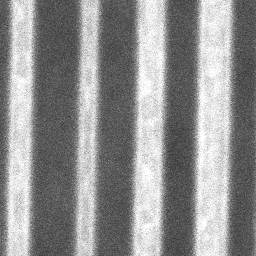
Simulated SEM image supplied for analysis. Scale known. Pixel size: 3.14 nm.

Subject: one or a few lines or trenches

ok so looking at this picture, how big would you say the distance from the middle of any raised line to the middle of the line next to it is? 197 nanometers